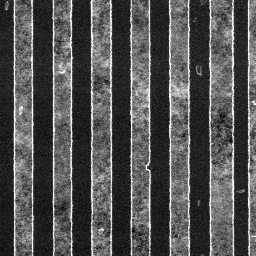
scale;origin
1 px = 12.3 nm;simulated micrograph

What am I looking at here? parallel lines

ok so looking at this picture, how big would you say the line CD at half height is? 231 nm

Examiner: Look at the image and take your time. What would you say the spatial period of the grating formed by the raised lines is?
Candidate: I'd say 0.486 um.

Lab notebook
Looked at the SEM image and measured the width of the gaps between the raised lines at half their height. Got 248 nanometres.